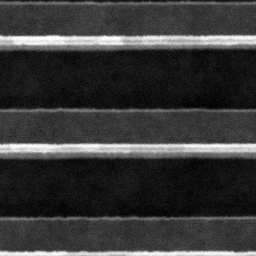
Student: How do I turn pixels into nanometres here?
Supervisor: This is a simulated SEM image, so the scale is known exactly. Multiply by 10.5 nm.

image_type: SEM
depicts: lines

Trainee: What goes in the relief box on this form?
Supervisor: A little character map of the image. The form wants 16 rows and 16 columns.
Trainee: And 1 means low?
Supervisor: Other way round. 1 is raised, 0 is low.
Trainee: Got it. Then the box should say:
1111111111111111
1111111111111111
1111111111111111
0000000000000000
0000000000000000
0000000000000000
0000000000000000
1111111111111111
1111111111111111
1111111111111111
0000000000000000
0000000000000000
0000000000000000
0000000000000000
1111111111111111
1111111111111111